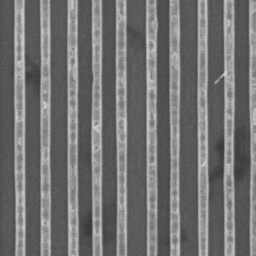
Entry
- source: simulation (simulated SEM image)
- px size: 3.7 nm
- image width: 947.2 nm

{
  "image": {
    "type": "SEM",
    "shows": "parallel lines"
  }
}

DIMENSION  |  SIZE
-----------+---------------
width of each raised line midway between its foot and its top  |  34.2 nm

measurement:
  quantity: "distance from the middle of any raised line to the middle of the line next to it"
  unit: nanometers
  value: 96.8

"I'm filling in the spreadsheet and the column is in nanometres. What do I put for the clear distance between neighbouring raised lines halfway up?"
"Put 62.8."